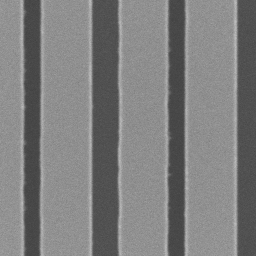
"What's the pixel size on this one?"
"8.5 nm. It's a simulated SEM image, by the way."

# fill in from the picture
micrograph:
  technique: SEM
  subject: lines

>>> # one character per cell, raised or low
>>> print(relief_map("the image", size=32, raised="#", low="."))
###..######....######..#######..
###..######....######..#######..
###..######....######..#######..
###..######....######..#######..
###..######....######..#######..
###..######....######..#######..
###..######....######..#######..
###..######....######..#######..
###..######....######..#######..
###..######....######..#######..
###..######....######..#######..
###..######....######..#######..
###..######....######..#######..
###..######....######..#######..
###..######....######..#######..
###..######....######..#######..
###..######....######..#######..
###..######....######..#######..
###..######....######..#######..
###..######....######..#######..
###..######....######..#######..
###..######....######..#######..
###..######....######..#######..
###..######....######..#######..
###..######....######..#######..
###..######....######..#######..
###..######....######..#######..
###..######....######..#######..
###..######....######..#######..
###..######....######..#######..
###..######....######..#######..
###..######....######..#######..